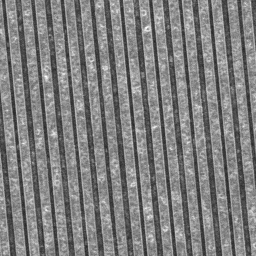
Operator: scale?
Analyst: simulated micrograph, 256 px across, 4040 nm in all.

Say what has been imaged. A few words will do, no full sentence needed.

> parallel lines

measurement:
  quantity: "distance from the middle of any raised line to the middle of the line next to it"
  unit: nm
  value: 231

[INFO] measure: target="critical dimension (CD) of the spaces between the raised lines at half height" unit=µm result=0.0706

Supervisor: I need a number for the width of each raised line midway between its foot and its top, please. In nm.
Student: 149